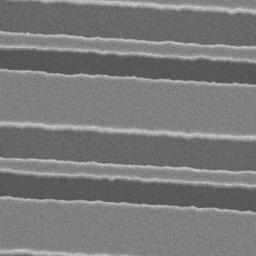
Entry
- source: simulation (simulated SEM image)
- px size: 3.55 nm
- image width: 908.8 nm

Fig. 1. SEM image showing lines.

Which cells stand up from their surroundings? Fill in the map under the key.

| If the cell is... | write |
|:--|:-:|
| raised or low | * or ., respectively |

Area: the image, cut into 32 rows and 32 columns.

..................**************
................................
................................
................................
*********.......................
************************........
............********************
............................****
................................
**************..................
****************************.*..
********************************
********************************
********************************
********************************
********************************
...................*************
................................
................................
................................
*************...................
..***************************.**
..................**************
................................
................................
*****************...............
*******************************.
********************************
********************************
********************************
********************************
**.*****************************